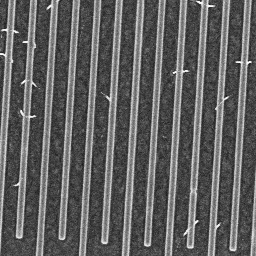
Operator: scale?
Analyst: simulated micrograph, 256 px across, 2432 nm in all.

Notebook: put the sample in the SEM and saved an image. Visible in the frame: parallel lines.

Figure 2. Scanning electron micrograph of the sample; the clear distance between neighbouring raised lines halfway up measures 146 nm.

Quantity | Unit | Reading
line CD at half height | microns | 0.0605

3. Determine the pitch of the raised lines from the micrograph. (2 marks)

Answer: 204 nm